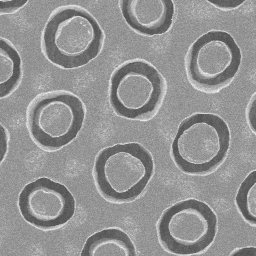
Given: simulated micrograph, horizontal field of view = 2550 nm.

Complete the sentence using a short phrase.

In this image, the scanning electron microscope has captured a regular array of ring-shaped grooves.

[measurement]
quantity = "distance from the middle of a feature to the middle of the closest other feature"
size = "822 nm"